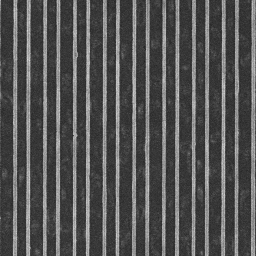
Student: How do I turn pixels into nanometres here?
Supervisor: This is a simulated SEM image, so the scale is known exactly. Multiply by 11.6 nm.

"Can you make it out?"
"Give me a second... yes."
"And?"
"parallel lines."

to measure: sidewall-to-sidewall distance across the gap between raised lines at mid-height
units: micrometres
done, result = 0.157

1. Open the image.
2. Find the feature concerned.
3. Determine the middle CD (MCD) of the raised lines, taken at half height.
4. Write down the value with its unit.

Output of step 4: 0.0391 µm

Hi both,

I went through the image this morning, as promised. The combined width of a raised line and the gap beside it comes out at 172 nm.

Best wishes